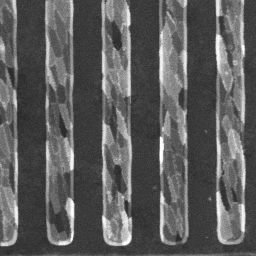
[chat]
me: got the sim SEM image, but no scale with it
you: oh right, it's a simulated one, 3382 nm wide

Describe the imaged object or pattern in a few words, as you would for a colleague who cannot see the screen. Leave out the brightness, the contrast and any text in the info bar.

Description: wiring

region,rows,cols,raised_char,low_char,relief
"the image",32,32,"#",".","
##....###....###....###....###..
##....###....###....###....###..
##....###....###....###....###..
##....###....###....###....###..
##....###....###....###....###..
##....###....###....###....###..
##....###....###....###....###..
##....###....###....###....###..
##....###....###....###....###..
##....###....###....###....###..
##....###....###....###....###..
##....###....###....###....###..
##....###....###....###....###..
##....###....###....###....###..
##....###....###....###....###..
##....###....###....###....###..
##....###....###....###....###..
##....###....###....###....###..
##....###....###....###....###..
##....###....###....###....###..
##....###....###....###....###..
##....###....###....###....###..
##....###....###....###....###..
##....###....###....###....###..
##....###....###....###....###..
##....###....###....###....###..
##....###....###....###....###..
##....###....###....###....###..
##....###....###....###....###..
##....###....###....###.....##..
................................
................................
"